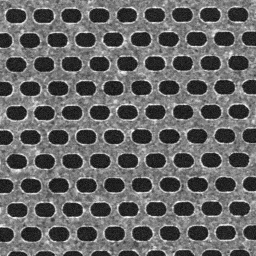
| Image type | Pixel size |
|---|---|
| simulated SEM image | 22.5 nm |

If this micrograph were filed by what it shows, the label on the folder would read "a regular array of holes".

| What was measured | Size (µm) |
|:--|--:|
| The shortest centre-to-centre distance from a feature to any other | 0.622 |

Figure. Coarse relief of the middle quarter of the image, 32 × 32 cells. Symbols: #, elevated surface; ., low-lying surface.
.....#......#.....##.....##.....
....###....###....###....###....
################################
################################
####...###....###....###....###.
.##.....##.....##.....##.....##.
.##.....##.....##.....##.....##.
.##.....##....###....###....###.
################################
################################
...####...####....###....###....
....##.....##.....##.....##.....
.....#......#......#......#.....
....###....###....###....###....
################################
################################
####...####...####...####...###.
.##.....##.....##.....##.....##.
.##.....##.....##.....##.....##.
.##.....##.....##....###....###.
################################
################################
#..####...####...####....###....
.....#.....##......#.....##.....
.....#......#......#......#.....
.....##....###....###....###....
################################
################################
####...####...####...####...####
.##.....##.....##.....##.....##.
..#.....##.....##.....##.....##.
.##.....##.....##.....##.....##.